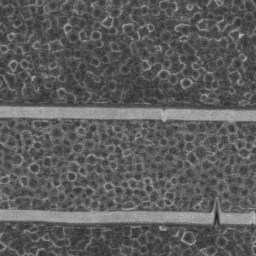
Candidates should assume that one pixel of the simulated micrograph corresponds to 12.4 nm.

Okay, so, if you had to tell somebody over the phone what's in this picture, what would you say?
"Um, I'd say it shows one or a few lines or trenches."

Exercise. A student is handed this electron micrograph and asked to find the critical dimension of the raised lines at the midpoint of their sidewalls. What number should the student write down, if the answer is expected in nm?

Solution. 1280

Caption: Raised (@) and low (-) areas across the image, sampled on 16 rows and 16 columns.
----------------
----------------
----------------
----------------
----------------
----------------
----------------
@@@@@@@@@@@@@@@@
@@@@@@@@@@@@@@@@
@@@@@@@@@@@@@@@@
@@@@@@@@@@@@@@@@
@@@@@@@@@@@@@@@@
@@@@@@@@@@@@@@@@
--@@@@@@@@@@@-@@
----------------
----------------